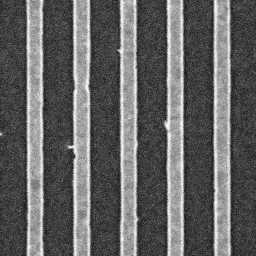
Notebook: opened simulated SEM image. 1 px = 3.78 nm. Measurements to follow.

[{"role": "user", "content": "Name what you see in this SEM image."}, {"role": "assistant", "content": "parallel lines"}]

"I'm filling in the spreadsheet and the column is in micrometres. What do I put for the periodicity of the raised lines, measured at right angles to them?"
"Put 0.177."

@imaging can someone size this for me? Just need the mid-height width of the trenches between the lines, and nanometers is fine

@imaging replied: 125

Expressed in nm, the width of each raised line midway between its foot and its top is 53.9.